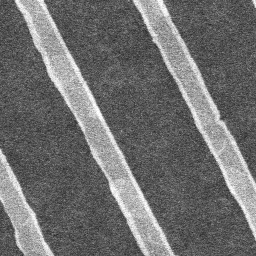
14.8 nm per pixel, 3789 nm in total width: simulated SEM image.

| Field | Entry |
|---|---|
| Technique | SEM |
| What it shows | one or a few lines or trenches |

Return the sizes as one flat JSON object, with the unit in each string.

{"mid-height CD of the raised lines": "324 nm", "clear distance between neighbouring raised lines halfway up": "1250 nanometres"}